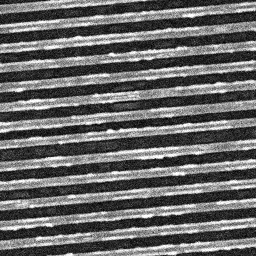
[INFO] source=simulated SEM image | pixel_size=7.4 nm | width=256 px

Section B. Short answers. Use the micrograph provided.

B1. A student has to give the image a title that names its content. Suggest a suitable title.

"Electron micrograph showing parallel lines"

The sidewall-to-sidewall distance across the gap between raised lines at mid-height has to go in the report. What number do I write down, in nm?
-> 79.2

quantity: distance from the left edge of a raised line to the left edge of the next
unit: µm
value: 0.145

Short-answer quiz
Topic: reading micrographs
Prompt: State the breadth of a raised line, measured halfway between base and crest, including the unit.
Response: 66.3 nanometers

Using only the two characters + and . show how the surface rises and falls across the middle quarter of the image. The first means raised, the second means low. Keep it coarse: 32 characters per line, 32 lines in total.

++..............................
.....................+.+++++++++
.........+++++++++++++++++++++++
++++++++++++++++++++++++........
++++++++++++....................
+..............................+
......................++++++++++
..........++++++++++++++++++++++
+++++++++++++++++++++++.........
+++++++++++++...................
................................
.....................+++++++++++
........++++++++++++++++++++++++
++++++++++++++++++++++..........
+++++++++++.....................
...........................+++++
...........+.+++++++++++++++++++
....+++++++++++++++++++++.......
++++++++++++++..................
+++.............................
...............................+
..................++++++++++++++
.........+++++++++++++++++++++++
+++++++++++++++++++++++++.......
++++++++++......................
..............................++
...................+++++++++++++
......+++++++++++++++++++++++++.
++++++++++++++++++..............
+++++++.+.......................
..............................++
.................+++++++++++++++